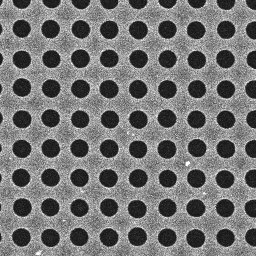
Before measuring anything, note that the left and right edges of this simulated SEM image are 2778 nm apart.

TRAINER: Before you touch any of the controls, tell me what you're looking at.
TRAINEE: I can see a regular array of holes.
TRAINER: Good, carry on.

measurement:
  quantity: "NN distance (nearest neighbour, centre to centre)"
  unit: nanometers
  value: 312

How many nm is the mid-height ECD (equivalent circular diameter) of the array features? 204